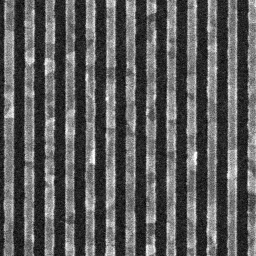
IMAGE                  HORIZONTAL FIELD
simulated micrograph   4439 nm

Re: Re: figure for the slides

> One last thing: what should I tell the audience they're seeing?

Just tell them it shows parallel lines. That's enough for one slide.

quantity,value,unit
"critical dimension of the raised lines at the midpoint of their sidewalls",124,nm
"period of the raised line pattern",352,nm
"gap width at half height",217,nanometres